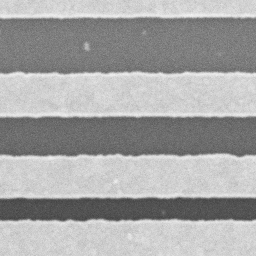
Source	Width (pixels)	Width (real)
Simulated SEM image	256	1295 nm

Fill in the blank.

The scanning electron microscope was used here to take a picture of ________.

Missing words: lines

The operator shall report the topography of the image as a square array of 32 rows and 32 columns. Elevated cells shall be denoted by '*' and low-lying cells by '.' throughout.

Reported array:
********************************
********************************
................................
................................
................................
................................
................................
................................
................................
********************************
********************************
********************************
********************************
********************************
******..*****....*...*.*..**..*.
................................
................................
................................
................................
..........*.***....***.*.****...
********************************
********************************
********************************
********************************
********************************
................................
................................
............*.....*..*..........
********************************
********************************
********************************
********************************